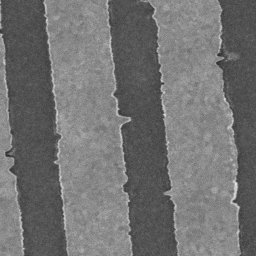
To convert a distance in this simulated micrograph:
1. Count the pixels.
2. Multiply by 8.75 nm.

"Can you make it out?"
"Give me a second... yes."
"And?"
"one or a few lines or trenches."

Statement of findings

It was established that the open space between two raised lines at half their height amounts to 401 nm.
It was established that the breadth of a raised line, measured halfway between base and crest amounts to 554 nanometres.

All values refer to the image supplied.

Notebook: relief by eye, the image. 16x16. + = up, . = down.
...++++...++++..
...++++...++++..
...++++...++++..
...++++...++++..
...++++...++++..
...++++...++++..
...++++...++++..
+...++++..+++++.
+...++++..+++++.
+...++++..+++++.
+...++++...++++.
+...++++...++++.
+...++++...++++.
+...++++...++++.
+...++++...++++.
+...++++...++++.